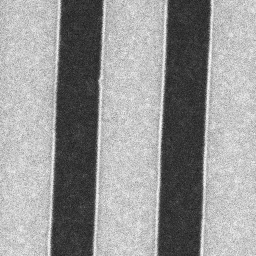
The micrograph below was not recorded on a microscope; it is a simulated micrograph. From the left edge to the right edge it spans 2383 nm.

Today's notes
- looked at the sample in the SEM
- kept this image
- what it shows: one or a few lines or trenches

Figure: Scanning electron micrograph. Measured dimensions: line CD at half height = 435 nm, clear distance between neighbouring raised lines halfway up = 561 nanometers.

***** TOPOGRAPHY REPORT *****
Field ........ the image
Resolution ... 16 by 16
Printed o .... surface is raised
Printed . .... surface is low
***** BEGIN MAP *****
....ooo...ooo...
....oo....ooo...
....oo....ooo...
....oo....ooo...
...ooo....ooo...
...ooo....ooo...
...ooo....ooo...
...ooo....ooo...
...ooo....ooo...
...ooo....ooo...
...ooo....ooo...
...ooo....ooo...
...ooo....ooo...
...ooo....ooo...
...ooo....ooo...
...ooo....ooo...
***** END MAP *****